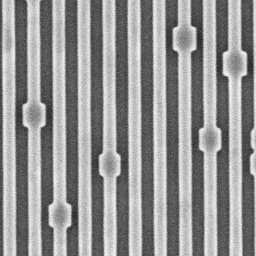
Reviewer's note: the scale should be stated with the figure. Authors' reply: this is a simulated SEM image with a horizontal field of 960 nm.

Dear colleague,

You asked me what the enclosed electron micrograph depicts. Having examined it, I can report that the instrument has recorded wiring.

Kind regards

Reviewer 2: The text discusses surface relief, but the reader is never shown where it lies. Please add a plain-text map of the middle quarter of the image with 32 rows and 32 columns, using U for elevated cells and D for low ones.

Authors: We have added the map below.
DDDDUUDDDDUUUDDDUUUDDDUUUDDDDUUU
DDDDUUDDDDUUUDDDUUUDDDUUUDDDDUUU
DDDDUUDDDDUUUDDDUUUDDDUUUDDDDUUU
DDDDUUDDDDUUUDDDUUUDDDUUUDDDDUUU
DDDDUUDDDDUUUDDDUUUDDDUUUDDDDUUU
DDDDUUDDDDUUUDDDUUUDDDUUUDDDDUUU
DDDDUUDDDDUUUDDDUUUDDDUUUDDDDUUU
DDDDUUDDDDUUUDDDUUUDDDUUUDDDDUUU
DDDDUUDDDDUUUDDDUUUDDDUUUDDDDUUU
DDDDUUDDDDUUUDDDUUUDDDUUUDDDDUUU
DDDDUUDDDDUUUDDDUUUDDDUUUDDDDUUU
DDDDUUDDDDUUUDDDUUUDDDUUUDDDDUUU
DDDDUUDDDDUUUDDDUUUDDDUUUDDDDUUU
DDDDUUDDDDUUUDDDUUUDDDUUUDDDDUUU
DDDDUUDDDDUUUDDDUUUDDDUUUDDDDUUU
DDDDUUDDDDUUUDDDUUUDDDUUUDDDDUUU
DDDDUUUDDDUUUDDDUUUDDDUUUDDDDUUU
DDDDUUUDDDUUUDDDUUUDDDUUUDDDDUUU
DDDDUUUDDDUUUDDDUUUDDDUUUDDDDUUU
DDDDUUUDDDUUUDDDUUUDDDDUUDDDDUUU
DDDDUUUDDDUUUDDDUUUDDDDUUDDDDUUU
DDDDUUUDDDUUUDDDUUUDDDDUUDDDDUUU
DDDDUUUDDUUUUDDDUUUDDDDUUDDDDUUU
DDDDUUUDDUUUUUDDUUUDDDDUUDDDDUUU
DDDDUUUDDUUUUUDDUUUDDDDUUDDDDUUU
DDDDUUUDDUUUUUDDUUUDDDDUUDDDDUUU
DDDDUUUDDUUUUUDDUUUDDDDUUDDDDUUU
DDDDUUUDDUUUUUDDUUUDDDDUUDDDDUUU
DDDDUUUDDDUUUDDDUUUDDDDUUDDDDUUU
DDDDUUUDDDUUUDDDUUUDDDDUUDDDDUUU
DDDDUUUDDDUUUDDDUUUDDDDUUDDDDUUU
DDDDUUUDDDUUUDDDUUUDDDDUUDDDDUUU